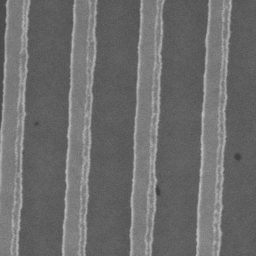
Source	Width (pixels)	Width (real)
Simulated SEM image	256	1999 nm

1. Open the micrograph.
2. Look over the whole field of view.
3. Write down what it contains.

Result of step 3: lines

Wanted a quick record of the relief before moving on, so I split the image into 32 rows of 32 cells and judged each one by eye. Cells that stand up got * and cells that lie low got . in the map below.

.***.....***......**......***...
.**......***......**......***...
.**......***......**......***...
.**......***......**......***...
.**......***.....***......***...
.**......***.....***......**....
.**......***.....***......**....
.**......***.....***......**....
.**......***.....***......**....
.**......***.....***......**....
***......**......***......**....
***......**......***......**....
***......**......***.....***....
***......**......***.....***....
***......**......***.....***....
***......**......***.....***....
***......**......***.....***....
***.....***......***.....***....
***.....***......**......***....
***.....***......**......***....
***.....***......**......***....
***.....***......**......***....
***.....***......**......***....
***.....***......**......***....
***.....***.....***......***....
***.....***.....***......***....
***.....***.....***......***....
**......***.....***......**.....
**......***.....***......**.....
**......***.....***......**.....
**......***.....***......**.....
**......***.....***......**.....